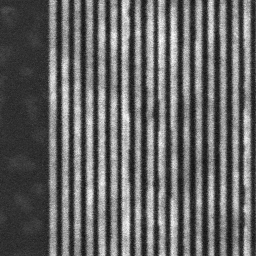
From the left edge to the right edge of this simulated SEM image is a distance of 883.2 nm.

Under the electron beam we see parallel lines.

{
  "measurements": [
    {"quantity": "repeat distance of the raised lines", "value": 0.0419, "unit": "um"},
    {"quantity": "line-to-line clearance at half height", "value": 0.0237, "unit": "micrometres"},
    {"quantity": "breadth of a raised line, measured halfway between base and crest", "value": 18.1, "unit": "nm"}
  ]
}